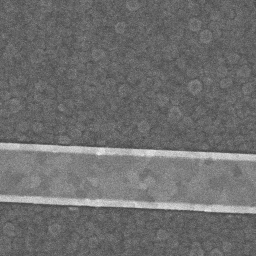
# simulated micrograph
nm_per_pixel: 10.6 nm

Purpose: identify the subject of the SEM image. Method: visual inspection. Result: one or a few lines or trenches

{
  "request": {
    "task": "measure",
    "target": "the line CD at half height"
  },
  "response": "566 nanometres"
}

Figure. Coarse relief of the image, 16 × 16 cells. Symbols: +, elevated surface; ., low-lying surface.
................
................
................
................
................
................
................
................
................
+++++++++.......
++++++++++++++++
++++++++++++++++
.+++++++++++++++
................
................
................